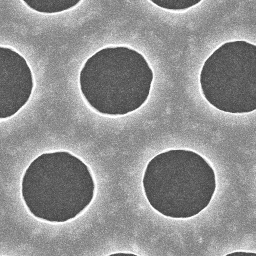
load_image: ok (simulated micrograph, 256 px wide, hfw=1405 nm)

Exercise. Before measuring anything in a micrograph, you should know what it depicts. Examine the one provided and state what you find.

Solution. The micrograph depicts holes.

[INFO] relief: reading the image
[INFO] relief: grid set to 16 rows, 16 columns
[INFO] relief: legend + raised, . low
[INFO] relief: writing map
++..++++++..++++
++++++++++++++++
++++++++++++++++
.+++++...++++...
..+++....++++...
..+++....++++...
..++++...++++...
++++++++++++++++
++++++++++++++++
+++.++++++..++++
++....+++....+++
+.....+++....+++
+.....+++....+++
++...+++++..++++
++++++++++++++++
++++++++++++++++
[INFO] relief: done